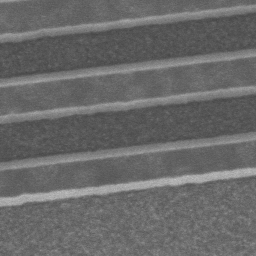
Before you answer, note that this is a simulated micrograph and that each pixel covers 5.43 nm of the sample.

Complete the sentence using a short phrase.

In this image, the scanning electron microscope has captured one or a few lines or trenches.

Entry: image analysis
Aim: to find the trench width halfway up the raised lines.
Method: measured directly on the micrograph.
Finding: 238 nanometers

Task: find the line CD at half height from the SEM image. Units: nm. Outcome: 201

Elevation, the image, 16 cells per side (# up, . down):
################
########........
................
..............##
.....###########
################
#########.......
................
................
.......#########
################
##########......
#...............
................
................
................